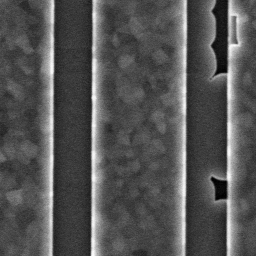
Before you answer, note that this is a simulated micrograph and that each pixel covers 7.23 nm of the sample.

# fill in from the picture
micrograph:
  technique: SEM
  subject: wiring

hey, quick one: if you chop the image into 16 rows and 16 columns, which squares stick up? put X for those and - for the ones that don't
XXX---XXXXXX--XX
XXX---XXXXXX---X
XXX---XXXXXX---X
XXX---XXXXXX--XX
XXX---XXXXXX--XX
XXX---XXXXXX--XX
XXX---XXXXXX--XX
XXX---XXXXXX--XX
XXX---XXXXXX--XX
XXX---XXXXX---XX
XXX---XXXXX---XX
XXX---XXXXX---XX
XXX---XXXXX---XX
XXX---XXXXX---XX
XXX---XXXXX---XX
XXX---XXXXX---XX